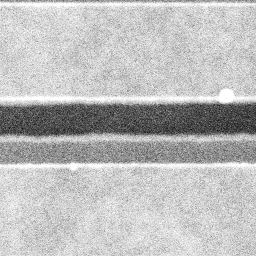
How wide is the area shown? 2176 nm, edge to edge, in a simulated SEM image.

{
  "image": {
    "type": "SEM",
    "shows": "lines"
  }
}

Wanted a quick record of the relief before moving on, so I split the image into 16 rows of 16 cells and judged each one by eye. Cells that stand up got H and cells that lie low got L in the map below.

HHHHHHHHHHHHHHHH
HHHHHHHHHHHHHHHH
HHHHHHHHHHHHHHHH
HHHHHHHHHHHHHHHH
HHHHHHHHHHHHHHHH
HHHHHHHHHHHHHHHH
LLLLLLLLLLLLLLLL
LLLLLLLLLLLLLLLL
LLLLLLLLLLLLLLLL
LLLLLLLLLLLLLLLL
HHHHHHHHHHHHHHHH
HHHHHHHHHHHHHHHH
HHHHHHHHHHHHHHHH
HHHHHHHHHHHHHHHH
HHHHHHHHHHHHHHHH
HHHHHHHHHHHHHHHH